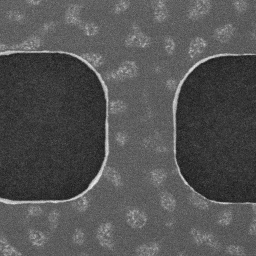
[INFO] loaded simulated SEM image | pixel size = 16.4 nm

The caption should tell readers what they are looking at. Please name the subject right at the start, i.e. holes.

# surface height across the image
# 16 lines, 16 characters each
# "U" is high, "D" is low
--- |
UUUUUUUUUUUUUUUU
UUUUUUUUUUUUUUUU
UUUUUUUUUUUUUUUU
DDDDDUUUUUUUUUDD
DDDDDDUUUUUUDDDD
DDDDDDDUUUUDDDDD
DDDDDDDUUUUDDDDD
DDDDDDDUUUUDDDDD
DDDDDDDUUUUDDDDD
DDDDDDDUUUUDDDDD
DDDDDDUUUUUDDDDD
DDDDDDUUUUUUDDDD
DDDDUUUUUUUUUDDD
UUUUUUUUUUUUUUUU
UUUUUUUUUUUUUUUU
UUUUUUUUUUUUUUUU